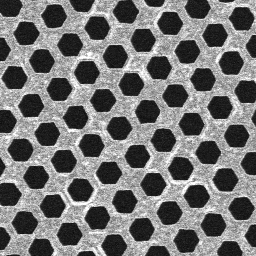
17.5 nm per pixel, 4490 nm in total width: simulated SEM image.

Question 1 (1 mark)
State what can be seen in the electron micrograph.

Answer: a regular array of holes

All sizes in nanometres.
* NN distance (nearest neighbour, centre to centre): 559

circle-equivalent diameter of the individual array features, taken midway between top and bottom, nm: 428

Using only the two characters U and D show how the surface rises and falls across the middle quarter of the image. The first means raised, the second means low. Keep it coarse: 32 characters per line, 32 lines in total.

UUUDDDDDUUUDDDDUUUUUUDDDDDDUUUUU
UUUDDDDDDUUUUUUUUUUUUDDDDDDUUUUU
UUDDDDDDDUUUUUUDDDUUUDDDDDUUUUUU
UUUDDDDDUUUUUUDDDDDUUUDDDDUUUUUU
DUUUDDDDUUUUUUDDDDDDUUUUUUUUUUUU
DDUUUUUUUUUUUUDDDDDDUUUUUUDDDDUU
DDUUUUUUDDDUUUDDDDDUUUUUUDDDDDUU
DUUUUUUDDDDDUUUDDDDUUUUUUDDDDDDU
DUUUUUUDDDDDDUUUUUUUUUUUUDDDDDDU
UUUUUUDDDDDDDUUUUUUDDDDUUDDDDDUU
UUDDDUUDDDDDUUUUUUDDDDDDUUDDDDUU
UDDDDUUUDDDDUUUUUUDDDDDDUUUUUUUU
DDDDDDUUUUUUUUUUUUDDDDDDUUUUUUDD
DDDDDDUUUUUUDDDUUUDDDDDUUUUUUDDD
DDDDDDUUUUUDDDDDUUUDDDDUUUUUUDDD
UDDDDUUUUUUDDDDDDUUUUUUUUUUUUDDD
UUUUUUUUUUUDDDDDDUUUUUUDDDDUUDDD
UUUUUDDDUUUDDDDDUUUUUUDDDDDUUUDD
UUUUDDDDDUUUDDDDUUUUUUDDDDDDUUUU
UUUUDDDDDDUUUUUUUUUUUUDDDDDDUUUU
UUUUDDDDDDUUUUUUUDDDUUDDDDDUUUUU
DUUUDDDDDDUUUUUUDDDDDUUDDDDUUUUU
DDUUUDDDDUUUUUUDDDDDDUUUUUUUUUUU
DDDUUUUUUUUUUUUDDDDDDUUUUUUDDDUU
DDDUUUUUUUDDDUUUDDDDDUUUUUUDDDDD
DDDUUUUUUDDDDDUUDDDDUUUUUUDDDDDD
DDUUUUUUDDDDDDUUUUUUUUUUUUDDDDDD
UUUUUUUUDDDDDDUUUUUUUDDDUUUDDDDD
UUUUUUUUUDDDDDUUUUUUDDDDDUUDDDDU
UUDDDDUUUDDDDUUUUUUDDDDDDUUUUUUU
UDDDDDDUUUUUUUUUUUUDDDDDDDUUUUUD
UDDDDDDUUUUUUUDDDUUUDDDDDUUUUUUD